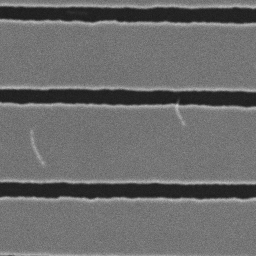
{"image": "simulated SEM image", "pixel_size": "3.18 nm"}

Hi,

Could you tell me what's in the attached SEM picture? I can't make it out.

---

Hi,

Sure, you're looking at lines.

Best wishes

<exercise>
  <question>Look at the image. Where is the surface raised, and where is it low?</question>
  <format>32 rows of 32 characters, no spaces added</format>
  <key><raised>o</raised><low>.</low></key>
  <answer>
oooooooooooooooooooooooooooooooo
................................
oo..............................
oooooooooooooooooooooooooooooooo
oooooooooooooooooooooooooooooooo
oooooooooooooooooooooooooooooooo
oooooooooooooooooooooooooooooooo
oooooooooooooooooooooooooooooooo
oooooooooooooooooooooooooooooooo
oooooooooooooooooooooooooooooooo
oooooooooooooooooooooooooooooooo
................................
................................
oooooooooooooooooooooooooooooooo
oooooooooooooooooooooooooooooooo
oooooooooooooooooooooooooooooooo
oooooooooooooooooooooooooooooooo
oooooooooooooooooooooooooooooooo
oooooooooooooooooooooooooooooooo
oooooooooooooooooooooooooooooooo
oooooooooooooooooooooooooooooooo
oooooooooooooooooooooooooooooooo
oooooooooooooooooooooooooooooooo
................................
................................
oooooooooooooooooooooooooooooooo
oooooooooooooooooooooooooooooooo
oooooooooooooooooooooooooooooooo
oooooooooooooooooooooooooooooooo
oooooooooooooooooooooooooooooooo
oooooooooooooooooooooooooooooooo
oooooooooooooooooooooooooooooooo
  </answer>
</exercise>